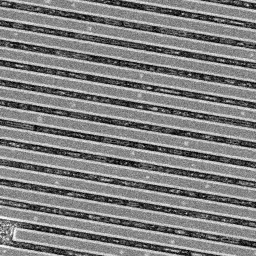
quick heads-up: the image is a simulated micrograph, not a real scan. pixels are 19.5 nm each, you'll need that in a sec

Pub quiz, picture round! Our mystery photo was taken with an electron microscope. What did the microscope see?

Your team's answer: parallel lines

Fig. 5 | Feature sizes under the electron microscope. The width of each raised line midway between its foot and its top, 204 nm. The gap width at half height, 170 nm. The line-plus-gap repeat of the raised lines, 382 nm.